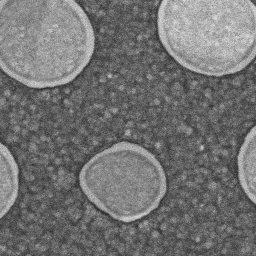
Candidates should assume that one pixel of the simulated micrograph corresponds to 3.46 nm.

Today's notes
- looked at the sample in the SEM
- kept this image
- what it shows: raised bodies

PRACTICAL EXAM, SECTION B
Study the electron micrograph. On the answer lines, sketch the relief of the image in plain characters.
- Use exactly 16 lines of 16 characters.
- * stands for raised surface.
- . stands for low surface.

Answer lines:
*****.....******
*****.....******
******....******
******.....*****
.****.......**..
................
................
................
................
.......**......*
*....*****.....*
*....*****.....*
*.....****......
.......**.......
................
................